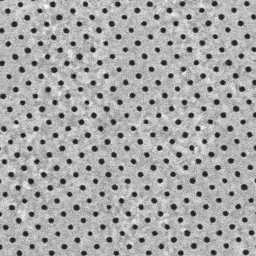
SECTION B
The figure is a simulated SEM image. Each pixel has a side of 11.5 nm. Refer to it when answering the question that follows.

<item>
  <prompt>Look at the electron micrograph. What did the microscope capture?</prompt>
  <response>a regular array of holes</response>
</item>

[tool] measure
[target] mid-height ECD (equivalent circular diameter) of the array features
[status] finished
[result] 69.7 nanometers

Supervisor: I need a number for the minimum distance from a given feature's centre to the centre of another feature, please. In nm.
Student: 163